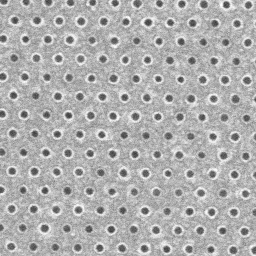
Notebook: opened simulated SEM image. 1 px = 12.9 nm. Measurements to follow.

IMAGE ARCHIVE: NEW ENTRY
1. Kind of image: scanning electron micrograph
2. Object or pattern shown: a regular array of holes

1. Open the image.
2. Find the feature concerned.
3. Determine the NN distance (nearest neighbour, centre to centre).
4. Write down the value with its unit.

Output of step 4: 279 nm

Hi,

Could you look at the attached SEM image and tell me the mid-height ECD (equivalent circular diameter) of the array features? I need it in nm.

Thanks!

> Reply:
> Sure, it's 112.